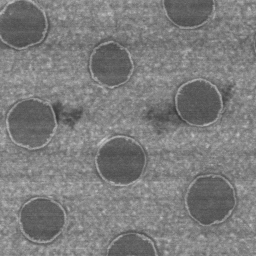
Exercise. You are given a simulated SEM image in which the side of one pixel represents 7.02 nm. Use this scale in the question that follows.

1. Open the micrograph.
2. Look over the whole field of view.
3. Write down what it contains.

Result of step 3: raised bodies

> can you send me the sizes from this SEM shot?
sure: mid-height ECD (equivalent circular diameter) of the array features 48.5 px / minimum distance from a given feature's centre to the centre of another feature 0.677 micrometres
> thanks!